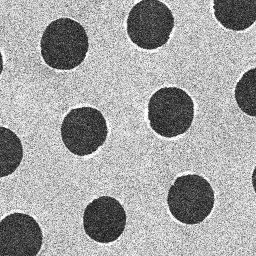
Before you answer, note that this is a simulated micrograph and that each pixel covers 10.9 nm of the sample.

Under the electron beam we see holes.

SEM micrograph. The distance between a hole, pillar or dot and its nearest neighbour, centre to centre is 964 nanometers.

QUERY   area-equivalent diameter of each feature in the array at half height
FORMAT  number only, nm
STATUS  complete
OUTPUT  526